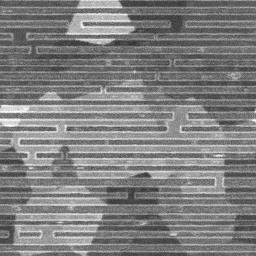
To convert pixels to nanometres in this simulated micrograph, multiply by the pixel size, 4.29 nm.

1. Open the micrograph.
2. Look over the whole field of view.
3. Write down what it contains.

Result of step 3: parallel lines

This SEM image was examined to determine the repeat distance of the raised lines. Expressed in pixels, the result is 13.1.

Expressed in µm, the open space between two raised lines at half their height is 0.0268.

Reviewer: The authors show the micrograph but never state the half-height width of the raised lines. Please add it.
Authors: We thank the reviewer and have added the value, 26.8 nanometres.